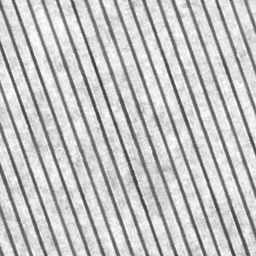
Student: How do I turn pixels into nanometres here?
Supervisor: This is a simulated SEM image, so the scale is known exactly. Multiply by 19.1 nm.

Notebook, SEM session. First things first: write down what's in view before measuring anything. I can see parallel lines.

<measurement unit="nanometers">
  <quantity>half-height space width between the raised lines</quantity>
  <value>80.8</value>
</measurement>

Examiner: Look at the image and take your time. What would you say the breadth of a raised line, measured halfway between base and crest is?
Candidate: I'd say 177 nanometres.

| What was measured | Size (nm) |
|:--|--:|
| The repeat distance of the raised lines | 260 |